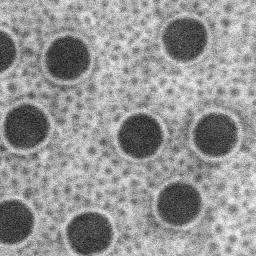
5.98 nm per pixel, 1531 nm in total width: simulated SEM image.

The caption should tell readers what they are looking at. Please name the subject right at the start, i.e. raised bodies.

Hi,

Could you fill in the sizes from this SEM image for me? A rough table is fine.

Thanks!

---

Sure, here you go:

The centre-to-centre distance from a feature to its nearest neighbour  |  470 nm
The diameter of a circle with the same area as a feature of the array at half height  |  303 nanometers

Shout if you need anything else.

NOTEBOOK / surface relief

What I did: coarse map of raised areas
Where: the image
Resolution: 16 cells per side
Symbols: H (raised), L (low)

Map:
LLLLLLLLLLLLLLLL
LLLLLLLLLLHHHLLL
HLLHHLLLLLHHHLLL
HLLHHHLLLLHHHLLL
LLLHHHLLLLLLLLLL
LLLLLLLLLLLLLLLL
LHLLLLLLLLLLLLLL
HHHLLLLLHHLLHHHL
HHHLLLLHHHLLHHHL
LLLLLLLLHHLLHHHL
LLLLLLLLLLLLLLLL
LLLLLLLLLLHHLLLL
HLLLLLLLLLHHHLLL
HHLLLHHLLLHHHLLL
HHLLHHHLLLLLLLLL
LLLLHHHLLLLLLLLL